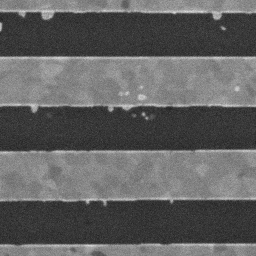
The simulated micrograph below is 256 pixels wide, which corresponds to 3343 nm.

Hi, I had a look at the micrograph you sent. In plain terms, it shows lines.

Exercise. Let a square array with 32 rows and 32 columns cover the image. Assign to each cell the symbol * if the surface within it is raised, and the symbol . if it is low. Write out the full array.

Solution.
********************************
..........*.......**************
................................
................................
................................
................................
................................
********************************
********************************
********************************
********************************
********************************
********************************
................................
................................
................................
................................
................................
................................
********************************
********************************
********************************
********************************
********************************
********************************
................................
................................
................................
................................
................................
................................
********************************